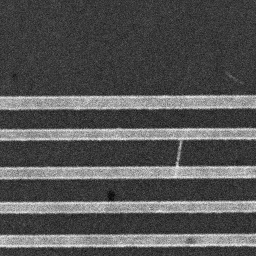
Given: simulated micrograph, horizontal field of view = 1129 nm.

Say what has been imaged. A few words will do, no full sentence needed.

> parallel lines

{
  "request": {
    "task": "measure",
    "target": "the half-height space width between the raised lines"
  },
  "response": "106 nanometers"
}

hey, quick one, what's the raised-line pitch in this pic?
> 152 nm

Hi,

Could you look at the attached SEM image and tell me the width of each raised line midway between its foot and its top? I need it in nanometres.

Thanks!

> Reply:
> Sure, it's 44.1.